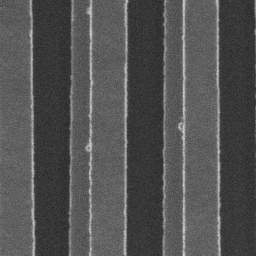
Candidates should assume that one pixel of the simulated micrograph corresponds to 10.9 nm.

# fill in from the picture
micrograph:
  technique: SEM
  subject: lines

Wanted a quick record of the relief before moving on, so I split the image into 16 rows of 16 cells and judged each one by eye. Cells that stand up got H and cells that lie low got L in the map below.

HHLLLHHHLLHHHHLL
HHLLLHHHLLHHHHLL
HHLLLHHHLLHHHHLL
HHLLLHHHLLHHHHLL
HHLLLHHHLLHHHHLL
HHLLHHHHLLHHHHLL
HHLLHHHHLLHHHHLL
HHLLHHHHLLHHHHLL
HHLLHHHHLLHHHHLL
HHLLHHHHLLHHHHLL
HHLLHHHHLLHHHHLL
HHLLHHHHLLHHHHLL
HHLLHHHHLLHHHHLL
HHLLHHHHLLHHHHLL
HHLLHHHHLLHHHHLL
HHLLHHHHLLHHHHLL